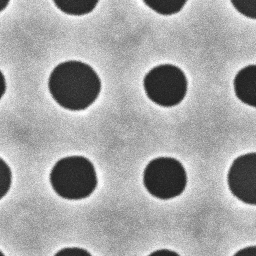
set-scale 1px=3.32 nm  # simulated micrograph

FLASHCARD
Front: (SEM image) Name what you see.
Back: holes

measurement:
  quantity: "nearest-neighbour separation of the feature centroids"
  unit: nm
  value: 304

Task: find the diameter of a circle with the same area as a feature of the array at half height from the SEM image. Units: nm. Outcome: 152